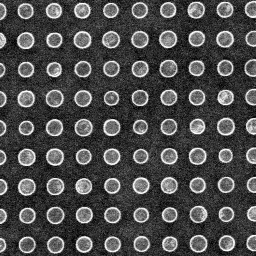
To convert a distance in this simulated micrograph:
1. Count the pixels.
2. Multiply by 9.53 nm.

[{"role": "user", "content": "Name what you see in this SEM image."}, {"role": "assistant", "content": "a regular array of raised bodies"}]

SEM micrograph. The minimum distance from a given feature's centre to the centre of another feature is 270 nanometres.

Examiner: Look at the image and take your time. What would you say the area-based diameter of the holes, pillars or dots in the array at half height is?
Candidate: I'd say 150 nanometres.